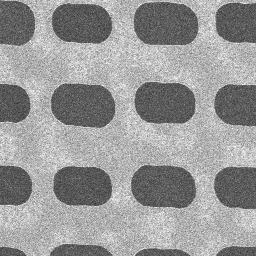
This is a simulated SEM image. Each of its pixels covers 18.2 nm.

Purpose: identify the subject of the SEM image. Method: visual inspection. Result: holes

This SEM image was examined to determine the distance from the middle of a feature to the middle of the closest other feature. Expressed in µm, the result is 1.47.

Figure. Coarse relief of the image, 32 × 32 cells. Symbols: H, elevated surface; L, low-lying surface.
LLLHHHHHLLLHHHHHHHLLLLHHHHHHLLLL
LLLLHHHLLLLLLHHHHLLLLLLLHHHLLLLL
LLLLHHLLLLLLLLHHHLLLLLLLLHHLLLLL
LLLLHHHLLLLLLLHHHLLLLLLLLHHLLLLL
LLLLHHHLLLLLLLHHHLLLLLLLLHHHLLLL
LLLHHHHHHHHHHHHHHHLLLLLLHHHHHHHH
HHHHHHHHHHHHHHHHHHHHHHHHHHHHHHHH
HHHHHHHHHHHHHHHHHHHHHHHHHHHHHHHH
HHHHHHHHHHHHHHHHHHHHHHHHHHHHHHHH
HHHHHHHHHHHHHHHHHHHHHHHHHHHHHHHH
LHHHHHHHLLHHHHHHHHLLLLLHHHHHHHHH
LLLHHHHLLLLLLLHHHLLLLLLLHHHLLLLL
LLLLHHLLLLLLLLHHHLLLLLLLHHHLLLLL
LLLLHHLLLLLLLLHHHLLLLLLLHHHLLLLL
LLLHHHHLLLLLLLHHHLLLLLLLHHHLLLLL
HHHHHHHHLLLLLHHHHHHHLHHHHHHHHLLL
HHHHHHHHHHHHHHHHHHHHHHHHHHHHHHHH
HHHHHHHHHHHHHHHHHHHHHHHHHHHHHHHH
HHHHHHHHHHHHHHHHHHHHHHHHHHHHHHHH
HHHHHHHHHHHHHHHHHHHHHHHHHHHHHHHH
HHHHHHHHHHHHHHHHHHHHHHHHHHHHHHHH
LLLHHHHLLLLLLHHHHLLLLLLLHHHLLLLL
LLLLHHHLLLLLLLHHLLLLLLLLHHHLLLLL
LLLLHHHLLLLLLLHHLLLLLLLLHHHLLLLL
LLLLHHHLLLLLLLHHHLLLLLLLHHHLLLLL
LLLHHHHHLLLLLHHHHHLLLLLLHHHHLLLL
HHHHHHHHHHHHHHHHHHHHHHHHHHHHHHHH
HHHHHHHHHHHHHHHHHHHHHHHHHHHHHHHH
HHHHHHHHHHHHHHHHHHHHHHHHHHHHHHHH
HHHHHHHHHHHHHHHHHHHHHHHHHHHHHHHH
HHHHHHHHHHHHHHHHHHHHHHHHHHHHHHHH
LLLHHHLLLLLLLLHHHLLLLLLHHHHLLLLL